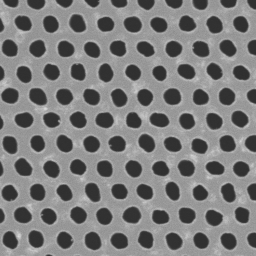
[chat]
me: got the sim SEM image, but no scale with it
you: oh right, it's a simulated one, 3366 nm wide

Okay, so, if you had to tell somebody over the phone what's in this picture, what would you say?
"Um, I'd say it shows a regular array of holes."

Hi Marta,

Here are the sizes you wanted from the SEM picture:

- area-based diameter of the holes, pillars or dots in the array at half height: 0.214 µm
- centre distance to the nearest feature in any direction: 26.2 pixels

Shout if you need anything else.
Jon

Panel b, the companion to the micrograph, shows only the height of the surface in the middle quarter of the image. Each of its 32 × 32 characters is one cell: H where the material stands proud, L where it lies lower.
HHLLLHHHHLLHHHHHLLHHHHHHHHHHHLLL
HHLLLHHHHLLLHHHLLLLHHHLLLLHHLLLL
HHLLLHHHHLLLHHHLLLLHHHLLLLHHHLLL
HHLLLHHHHLLLHHHHLLLHHHHLLLHHHHLL
HHHHHHHHHHHHHHHHHHHHHHHHHHHHHHHH
HHHHHHHHHHHHHHHHHHHHHHHHHHHHHHHH
LHHHHLLLHHHHLLLHHHHLLHHHHHLLLHHH
LLHHHLLLLHHHLLLHHHLLLLHHHLLLLHHH
LLHHHLLLLHHHLLLLHHLLLLHHHLLLLHHH
LLHHHLLLLHHHLLLLHHHLLLHHHHLLLHHH
HHHHHHHHHHHHHLLHHHHHLHHHHHHHHHHH
HHHHHHHHHHHHHHHHHHHHHHHHHHHHHHHH
HHLLLHHHHLLLHHHHLLHHHHLLLHHHHHLL
HLLLLHHHLLLLHHHHLLLHHHLLLLHHHLLL
HHLLLLHHLLLLHHHLLLLLHHLLLLHHHLLL
HHLLLHHHHLLLHHHHLLLHHHHLLLHHHHLL
HHHHHHHHHHHHHHHHHHHHHHHHHHHHHHHH
HHHHHHHHHHHHHHHHHHHHHHHHHHHHHHHH
LHHHHLLLHHHHLLLHHHHLLLHHHHLLHHHH
LLHHHLLLLHHLLLLHHHHLLLLHHLLLLHHH
LLHHHLLLLHHLLLLHHHHLLLLHHLLLLHHH
LLHHHLLLHHHHLLLHHHHHLLHHHHLLLHHH
HHHHHHHHHHHHHHHHHHHHHHHHHHHHHHHH
HHHHHHHHHHHHHHHHHHHHHHHHHHHHHHHH
HHLLLHHHHLLHHHHHLLHHHHHLLHHHHLLL
HLLLLHHHLLLLHHHLLLLHHHLLLLHHHLLL
HLLLLHHHLLLLHHHLLLLLHHLLLLHHHLLL
HHLLLHHHHLLLHHHHLLLHHHHLLLHHHLLL
HHHHHHHHHHHHHHHHHHHHHHHHHHHHHHHH
HHHHHHHHHHHHHHHHHHHHHHHHHHHHHHHH
LHHHHLLLHHHHLLLHHHHLLHHHHHLLHHHH
LLHHHLLLLHHHLLLLHHLLLLHHHLLLLHHH